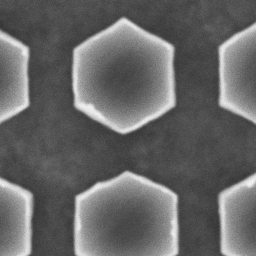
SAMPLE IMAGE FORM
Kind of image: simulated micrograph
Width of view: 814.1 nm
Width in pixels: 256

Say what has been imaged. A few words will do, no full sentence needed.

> raised bodies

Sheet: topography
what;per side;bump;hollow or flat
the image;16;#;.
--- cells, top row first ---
................
.......#........
#.....####....##
##...######...##
##...######...##
##...######...##
##...######...##
......###.......
................
................
................
#.....####.....#
##...######...##
##...######...##
##...######...##
##...######...##